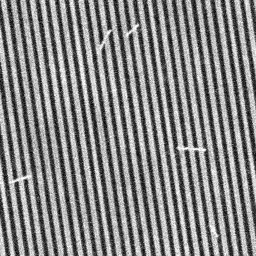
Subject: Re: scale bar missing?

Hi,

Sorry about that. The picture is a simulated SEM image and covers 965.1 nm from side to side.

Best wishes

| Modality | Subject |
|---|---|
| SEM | parallel lines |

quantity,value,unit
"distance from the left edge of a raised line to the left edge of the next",9.6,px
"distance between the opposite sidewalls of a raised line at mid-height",0.0186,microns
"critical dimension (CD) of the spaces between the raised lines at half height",18.6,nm